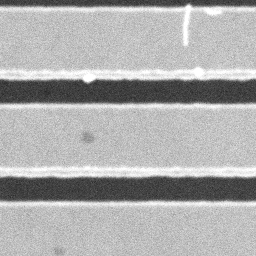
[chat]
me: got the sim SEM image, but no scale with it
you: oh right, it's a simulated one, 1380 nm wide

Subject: lines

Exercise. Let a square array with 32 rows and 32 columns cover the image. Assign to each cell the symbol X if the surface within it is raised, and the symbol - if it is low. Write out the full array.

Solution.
--------------------------------
XXXXXXXXXXXXXXXXXXXXXXXXXXXXXXXX
XXXXXXXXXXXXXXXXXXXXXXXXXXXXXXXX
XXXXXXXXXXXXXXXXXXXXXXXXXXXXXXXX
XXXXXXXXXXXXXXXXXXXXXXXXXXXXXXXX
XXXXXXXXXXXXXXXXXXXXXXXXXXXXXXXX
XXXXXXXXXXXXXXXXXXXXXXXXXXXXXXXX
XXXXXXXXXXXXXXXXXXXXXXXXXXXXXXXX
XXXXXXXXXXXXXXXXXXXXXXXXXXXXXXXX
XXXXXXXXXXXXXXXXXXXXXXXXXXXXXXXX
--------------------------------
--------------------------------
--------------------------------
XXXXXXXXXXXXXXXXXXXXXXXXXXXXXXXX
XXXXXXXXXXXXXXXXXXXXXXXXXXXXXXXX
XXXXXXXXXXXXXXXXXXXXXXXXXXXXXXXX
XXXXXXXXXXXXXXXXXXXXXXXXXXXXXXXX
XXXXXXXXXXXXXXXXXXXXXXXXXXXXXXXX
XXXXXXXXXXXXXXXXXXXXXXXXXXXXXXXX
XXXXXXXXXXXXXXXXXXXXXXXXXXXXXXXX
XXXXXXXXXXXXXXXXXXXXXXXXXXXXXXXX
XXXXXXXXXXXXXXXXXXXXXXXXXXXXXXXX
--------------------------------
--------------------------------
--------------------------------
XXXXXXXXXXXXXXXXXXXXXXXXXXXXXXXX
XXXXXXXXXXXXXXXXXXXXXXXXXXXXXXXX
XXXXXXXXXXXXXXXXXXXXXXXXXXXXXXXX
XXXXXXXXXXXXXXXXXXXXXXXXXXXXXXXX
XXXXXXXXXXXXXXXXXXXXXXXXXXXXXXXX
XXXXXXXXXXXXXXXXXXXXXXXXXXXXXXXX
XXXXXXXXXXXXXXXXXXXXXXXXXXXXXXXX